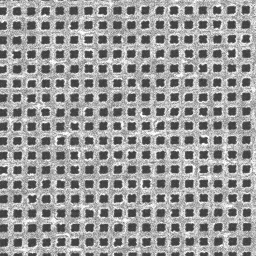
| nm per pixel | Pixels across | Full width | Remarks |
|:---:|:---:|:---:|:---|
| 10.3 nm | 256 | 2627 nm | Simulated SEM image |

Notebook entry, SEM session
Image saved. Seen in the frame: a regular array of holes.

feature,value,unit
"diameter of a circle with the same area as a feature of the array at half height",0.0947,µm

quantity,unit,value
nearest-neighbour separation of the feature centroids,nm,144